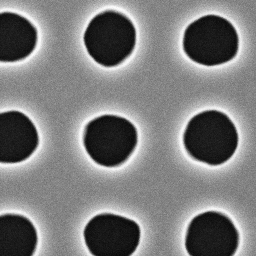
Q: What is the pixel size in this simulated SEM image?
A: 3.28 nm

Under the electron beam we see holes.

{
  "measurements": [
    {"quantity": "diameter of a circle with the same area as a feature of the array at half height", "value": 178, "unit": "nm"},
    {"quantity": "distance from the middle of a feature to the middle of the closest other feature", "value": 324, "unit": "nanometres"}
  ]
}